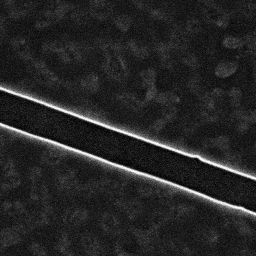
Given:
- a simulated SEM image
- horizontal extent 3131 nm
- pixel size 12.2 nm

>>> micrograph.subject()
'one or a few lines or trenches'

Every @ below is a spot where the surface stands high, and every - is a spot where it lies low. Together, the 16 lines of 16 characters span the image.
@@@@@@@@@@@@@@@@
@@@@@@@@@@@@@@@@
@@@@@@@@@@@@@@@@
@@@@@@@@@@@@@@@@
@@@@@@@@@@@@@@@@
@@@@@@@@@@@@@@@@
---@@@@@@@@@@@@@
-----@@@@@@@@@@@
@@------@@@@@@@@
@@@@@------@@@@@
@@@@@@@@------@@
@@@@@@@@@@@-----
@@@@@@@@@@@@@---
@@@@@@@@@@@@@@@@
@@@@@@@@@@@@@@@@
@@@@@@@@@@@@@@@@